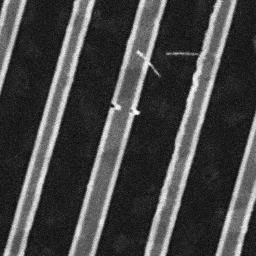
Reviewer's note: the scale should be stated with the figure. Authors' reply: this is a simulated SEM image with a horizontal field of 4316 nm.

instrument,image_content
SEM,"one or a few lines or trenches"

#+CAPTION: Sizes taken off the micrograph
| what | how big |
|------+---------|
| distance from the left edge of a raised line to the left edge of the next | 1150 nanometers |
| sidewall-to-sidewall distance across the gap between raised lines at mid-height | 0.872 micrometres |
